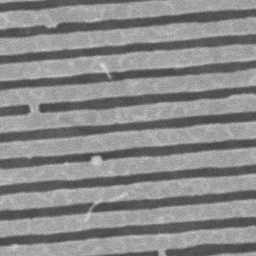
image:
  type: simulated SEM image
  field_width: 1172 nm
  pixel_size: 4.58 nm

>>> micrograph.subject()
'parallel lines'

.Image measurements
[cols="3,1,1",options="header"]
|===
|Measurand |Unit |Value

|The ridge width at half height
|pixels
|15.1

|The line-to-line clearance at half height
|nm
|48.5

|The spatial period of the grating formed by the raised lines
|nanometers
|119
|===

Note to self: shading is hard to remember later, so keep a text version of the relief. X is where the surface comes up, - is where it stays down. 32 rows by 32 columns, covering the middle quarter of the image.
XXXXXXXXXXXXXXXXXXXXXXXXXXXXXX--
XXXXXXXXXXXXXXX-----------------
XXX-----------------------------
------------------------XXXXXXXX
------------XXXXXXXXXXXXXXXXXXXX
XXXXXXXXXXXXXXXXXXXXXXXXXXXXXXXX
XXXXXXXXXXXXXXXXXXXXXXXXXXXXXXXX
XXXXXXXXXXXXXXXXXXX-------------
XXXXXXX-------------------------
--------------------------------
------------------XXXXXXXXXXXXXX
-----------XXXXXXXXXXXXXXXXXXXXX
XXXXXXXXXXXXXXXXXXXXXXXXXXXXXXXX
XXXXXXXXXXXXXXXXXXXXXXXXXXX-----
XXXXXXXXXXXXXXXXXX--------------
--------------------------------
-----------------------XXXXXXXXX
-----------XXXXXXXXXXXXXXXXXXXXX
--XXXXXXXXXXXXXXXXXXXXXXXXXXXXXX
XXXXXXXXXXXXXXXXXXXXXXXXXXXXXXXX
XXXXXXXXXXXXXXXXXXXXX-----------
XXXXXXXXXXX---------------------
-------------------------------X
-------XX----------XXXXXXXXXXXXX
-------XXXXXXXXXXXXXXXXXXXXXXXXX
XXXXXXXXXXXXXXXXXXXXXXXXXXXXXXXX
XXXXXXXXXXXXXXXXXXXXXXXXXX------
XXXXXXXXXXXXXXXXX---------------
XXXXX---------------------------
------------------------XXXXXXXX
---------------XXXXXXXXXXXXXXXXX
---XXXXXXXXXXXXXXXXXXXXXXXXXXXXX